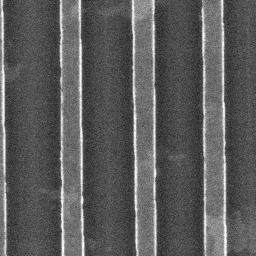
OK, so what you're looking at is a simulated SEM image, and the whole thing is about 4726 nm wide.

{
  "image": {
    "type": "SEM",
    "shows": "lines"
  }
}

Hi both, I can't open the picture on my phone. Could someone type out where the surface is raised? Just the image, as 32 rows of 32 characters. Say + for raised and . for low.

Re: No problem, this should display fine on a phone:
........++.......++......+++....
........++.......++......+++....
........++.......++......+++....
........++.......++......+++....
........++.......++......+++....
........++.......++......+++....
........++.......++......+++....
........++.......++......+++....
........++.......++.......++....
........++.......++.......++....
........++.......++.......++....
........++.......++.......++....
........++.......++.......++....
........++.......++.......++....
........++.......++.......++....
........++.......++.......++....
+.......++.......++.......++....
+.......++.......++.......++....
+.......++.......++.......++....
+.......++.......++.......++....
+.......++.......++.......++....
+.......++.......++.......++....
+.......++.......++.......++....
+.......++.......++.......++....
+.......++.......++.......++....
+.......++.......++.......++....
+.......++.......++.......++....
+.......++.......++.......++....
+.......++.......++.......++....
+.......++.......++.......++....
+.......++.......++.......++....
+.......++.......++.......++....